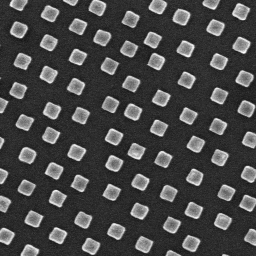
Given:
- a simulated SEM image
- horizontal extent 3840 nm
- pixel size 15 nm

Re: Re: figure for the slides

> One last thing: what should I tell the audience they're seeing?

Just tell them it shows a regular array of raised bodies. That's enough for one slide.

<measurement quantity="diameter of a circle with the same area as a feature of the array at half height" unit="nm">226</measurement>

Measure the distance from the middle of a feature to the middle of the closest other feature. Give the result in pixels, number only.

28.8